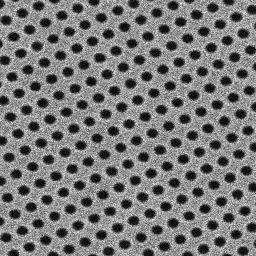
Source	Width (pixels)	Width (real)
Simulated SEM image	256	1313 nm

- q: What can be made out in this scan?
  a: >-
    a regular array of holes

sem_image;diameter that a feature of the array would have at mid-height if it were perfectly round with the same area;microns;0.0555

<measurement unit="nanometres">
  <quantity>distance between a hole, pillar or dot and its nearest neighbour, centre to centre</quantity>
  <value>90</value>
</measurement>